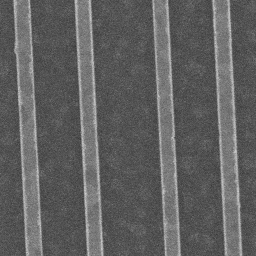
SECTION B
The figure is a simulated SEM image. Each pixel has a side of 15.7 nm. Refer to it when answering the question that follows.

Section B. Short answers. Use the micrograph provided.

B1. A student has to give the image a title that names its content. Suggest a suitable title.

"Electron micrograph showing one or a few lines or trenches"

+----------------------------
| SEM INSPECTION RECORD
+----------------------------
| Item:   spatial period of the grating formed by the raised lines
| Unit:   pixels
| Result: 66.3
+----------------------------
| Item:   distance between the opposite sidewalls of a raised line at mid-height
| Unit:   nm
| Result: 229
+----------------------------